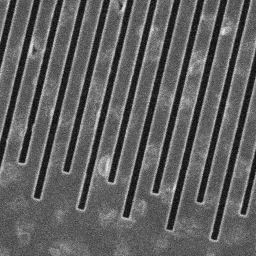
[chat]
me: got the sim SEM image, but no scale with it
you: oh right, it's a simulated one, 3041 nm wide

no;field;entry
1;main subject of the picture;parallel lines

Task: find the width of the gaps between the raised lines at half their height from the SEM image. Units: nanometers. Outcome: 80.9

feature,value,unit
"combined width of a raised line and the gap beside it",270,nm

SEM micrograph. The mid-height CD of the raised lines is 195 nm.